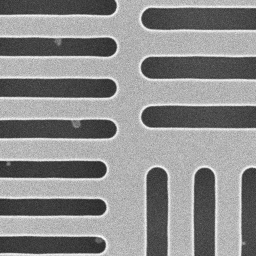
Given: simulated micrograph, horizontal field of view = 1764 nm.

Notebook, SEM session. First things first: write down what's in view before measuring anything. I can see groups of lines, slits or small figures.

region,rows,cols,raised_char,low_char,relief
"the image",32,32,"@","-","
---------------@@@@@@@@@@@@@@@@@
--------------@@@@--------------
@@@@@@@@@@@@@@@@@@--------------
@@@@@@@@@@@@@@@@@@--------------
@@@@@@@@@@@@@@@@@@@@@@@@@@@@@@@@
---------------@@@@@@@@@@@@@@@@@
--------------@@@@@@@@@@@@@@@@@@
@@@@@@@@@@@@@@@@@@--------------
@@@@@@@@@@@@@@@@@@--------------
@@@@@@@@@@@@@@@@@@--------------
--------------@@@@@@@@@@@@@@@@@@
--------------@@@@@@@@@@@@@@@@@@
@@@@@@@@@@@@@@@@@@@@@@@@@@@@@@@@
@@@@@@@@@@@@@@@@@@--------------
@@@@@@@@@@@@@@@@@@--------------
--------------@@@@--------------
---------------@@@@@@@@@@@@@@@@@
@@@@@@@@@@@@@@@@@@@@@@@@@@@@@@@@
@@@@@@@@@@@@@@@@@@@@@@@@@@@@@@@@
@@@@@@@@@@@@@@@@@@@@@@@@@@@@@@@@
-------------@@@@@@@@@@@@@@@@@@@
-------------@@@@@@--@@@---@@@--
@@@@@@@@@@@@@@@@@@---@@@---@@@--
@@@@@@@@@@@@@@@@@@---@@@---@@@--
@@@@@@@@@@@@@@@@@@---@@@---@@@--
-------------@@@@@---@@@---@@@--
-------------@@@@@---@@@---@@@--
@@@@@@@@@@@@@@@@@@---@@@---@@@--
@@@@@@@@@@@@@@@@@@---@@@---@@@--
------@@@@@@@@@@@@---@@@---@@@--
-------------@@@@@---@@@---@@@--
-------------@@@@@---@@@---@@@--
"